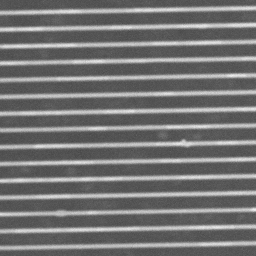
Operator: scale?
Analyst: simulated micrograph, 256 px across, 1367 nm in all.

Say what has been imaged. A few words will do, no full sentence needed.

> parallel lines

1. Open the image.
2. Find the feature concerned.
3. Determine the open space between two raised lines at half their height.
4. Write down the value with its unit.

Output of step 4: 73.4 nanometers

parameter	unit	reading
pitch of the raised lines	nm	89.7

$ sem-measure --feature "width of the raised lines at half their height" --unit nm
19.3